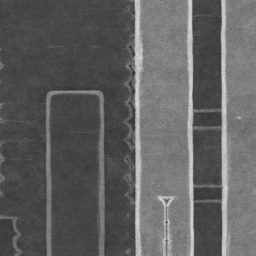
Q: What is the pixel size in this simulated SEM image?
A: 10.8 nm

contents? wiring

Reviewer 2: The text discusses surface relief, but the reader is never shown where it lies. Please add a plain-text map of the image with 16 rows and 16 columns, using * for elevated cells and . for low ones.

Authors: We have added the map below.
.........***..**
.........***..**
.........***..**
.........***..**
.........***..**
.........***..**
...***...***..**
...***...***..**
...***...***..**
...***...***..**
...***...***..**
...***...***..**
...***...***..**
...***...***..**
...***...***..**
...***...***..**